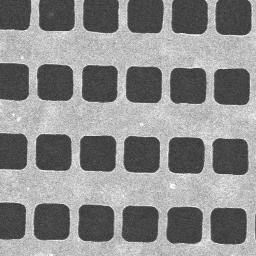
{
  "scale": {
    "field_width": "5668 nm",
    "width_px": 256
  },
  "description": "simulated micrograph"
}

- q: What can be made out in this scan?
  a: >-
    a regular array of holes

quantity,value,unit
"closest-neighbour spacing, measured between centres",974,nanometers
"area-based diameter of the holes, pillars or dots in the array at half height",0.884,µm